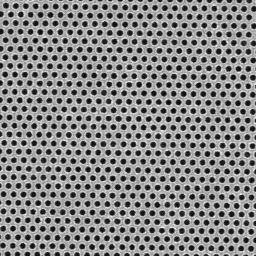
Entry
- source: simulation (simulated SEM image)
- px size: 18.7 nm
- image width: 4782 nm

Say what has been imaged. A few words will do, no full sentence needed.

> a regular array of holes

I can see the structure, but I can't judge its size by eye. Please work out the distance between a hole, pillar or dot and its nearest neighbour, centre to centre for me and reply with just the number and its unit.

176 nm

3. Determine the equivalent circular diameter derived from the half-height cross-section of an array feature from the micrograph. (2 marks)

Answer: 112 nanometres